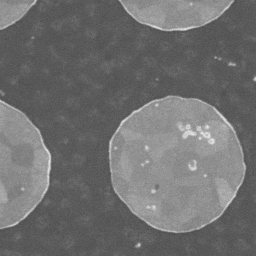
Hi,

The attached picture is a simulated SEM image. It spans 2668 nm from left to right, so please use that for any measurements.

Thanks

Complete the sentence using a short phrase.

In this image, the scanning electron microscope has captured raised bodies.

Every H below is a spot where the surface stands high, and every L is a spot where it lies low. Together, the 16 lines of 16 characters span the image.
HHLLLLLLHHHHHHLL
HLLLLLLLLHHHHLLL
LLLLLLLLLLLLLLLL
LLLLLLLLLLLLLLLL
LLLLLLLLLLLLLLLL
LLLLLLLLLLLLLLLL
LLLLLLLLLHHHHLLL
HHLLLLLLHHHHHHLL
HHHLLLLHHHHHHHHL
HHHLLLLHHHHHHHHL
HHHLLLLHHHHHHHHL
HHHLLLLHHHHHHHHL
HHHLLLLLHHHHHHLL
HHLLLLLLLHHHHHLL
LLLLLLLLLLLLLLLL
LLLLLLLLLLLLLLLL